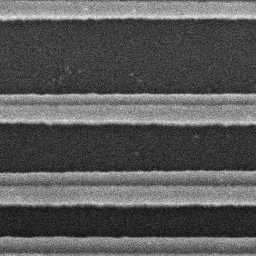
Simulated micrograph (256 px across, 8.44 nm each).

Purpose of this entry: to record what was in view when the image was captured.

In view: lines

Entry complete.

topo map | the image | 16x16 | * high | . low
****************
................
................
................
................
................
****************
****************
................
................
................
****************
****************
................
................
****************